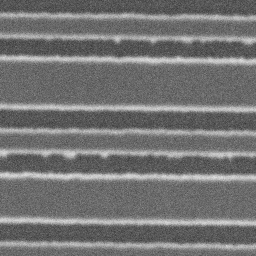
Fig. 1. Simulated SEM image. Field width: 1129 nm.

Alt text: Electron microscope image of lines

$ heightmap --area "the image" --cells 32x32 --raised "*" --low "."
................................
................................
********************************
********************************
********************************
................................
................................
******************************..
********************************
********************************
********************************
********************************
********************************
..**...*************************
................................
................................
**************************...**.
********************************
********************************
................................
................................
................................
********************************
********************************
********************************
********************************
********************************
********************************
................................
................................
***************.*..**...........
********************************